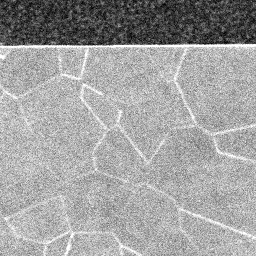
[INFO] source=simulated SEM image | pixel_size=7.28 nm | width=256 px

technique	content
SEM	one or a few lines or trenches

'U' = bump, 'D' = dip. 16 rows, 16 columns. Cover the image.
DDDDDDDDDDDDDDDD
DDDDDDDDDDDDDDDD
DDDDDDDDDDDDDDDD
UUUUUUUUUUUUUUUU
UUUUUUUUUUUUUUUU
UUUUUUUUUUUUUUUU
UUUUUUUUUUUUUUUU
UUUUUUUUUUUUUUUU
UUUUUUUUUUUUUUUU
UUUUUUUUUUUUUUUU
UUUUUUUUUUUUUUUU
UUUUUUUUUUUUUUUU
UUUUUUUUUUUUUUUU
UUUUUUUUUUUUUUUU
UUUUUUUUUUUUUUUU
UUUUUUUUUUUUUUUU